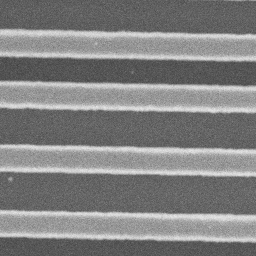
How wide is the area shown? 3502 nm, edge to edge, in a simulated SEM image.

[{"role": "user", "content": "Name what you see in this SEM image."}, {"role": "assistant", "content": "lines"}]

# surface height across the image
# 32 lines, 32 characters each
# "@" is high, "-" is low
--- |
--------------------------------
--------------------------------
--------------------------------
--------------------------------
@@@@@@@@@@@@@@@@@@@@@@@@@@@@@@@@
@@@@@@@@@@@@@@@@@@@@@@@@@@@@@@@@
@@@@@@@@@@@@@@@@@@@@@@@@@@@@@@@@
-----------------------@@@@@@@@@
--------------------------------
--------------------------------
@@@@@@@@@@@@-@------------------
@@@@@@@@@@@@@@@@@@@@@@@@@@@@@@@@
@@@@@@@@@@@@@@@@@@@@@@@@@@@@@@@@
-@@-@@@@@@@@@@@@@@@@@@@@@@@@@@@@
--------------------------------
--------------------------------
--------------------------------
--------------------------------
@@@@@@@@@@@@@@@@@@@@------------
@@@@@@@@@@@@@@@@@@@@@@@@@@@@@@@@
@@@@@@@@@@@@@@@@@@@@@@@@@@@@@@@@
----------@@@@@@@@@@@@@@@@@@@@@@
--------------------------------
--------------------------------
--------------------------------
--------------------------------
@@@@@@@@------------------------
@@@@@@@@@@@@@@@@@@@@@@@@@@@@@@@@
@@@@@@@@@@@@@@@@@@@@@@@@@@@@@@@@
@@@@@@@@@@@@@@@@@@@@@@@@@@@@@@@@
--------------------------------
--------------------------------